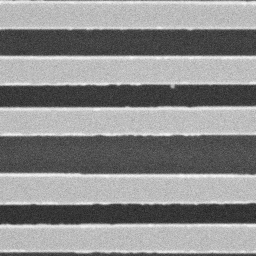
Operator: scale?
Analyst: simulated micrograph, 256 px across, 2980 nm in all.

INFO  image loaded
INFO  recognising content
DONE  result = lines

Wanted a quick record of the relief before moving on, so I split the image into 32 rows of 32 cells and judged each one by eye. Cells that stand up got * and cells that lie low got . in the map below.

********************************
********************************
********************************
********************************
................................
................................
................................
********************************
********************************
********************************
***************.**..............
................................
................................
...................*************
********************************
********************************
********************************
................................
................................
................................
................................
................................
********************************
********************************
********************************
................................
................................
................................
********************************
********************************
********************************
.........***.*.*****************